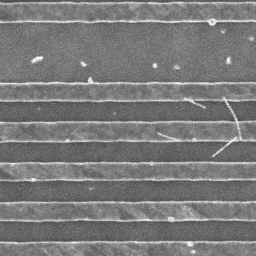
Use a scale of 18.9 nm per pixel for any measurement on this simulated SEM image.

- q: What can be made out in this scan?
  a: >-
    wiring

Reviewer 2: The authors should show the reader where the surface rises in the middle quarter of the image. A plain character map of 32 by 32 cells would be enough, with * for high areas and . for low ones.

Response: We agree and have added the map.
................................
................................
................................
................................
................................
********************************
********************************
********************************
********************************
................................
................................
................................
................................
................................
..........................******
********************************
********************************
********************************
********************************
................................
................................
................................
................................
................................
................................
********************************
********************************
********************************
********************************
................................
................................
................................